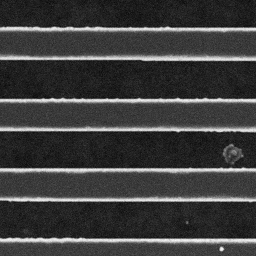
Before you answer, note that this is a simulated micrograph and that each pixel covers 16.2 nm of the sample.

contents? lines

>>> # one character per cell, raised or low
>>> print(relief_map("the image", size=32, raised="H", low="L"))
LLLLLLLLLLLLLLLLLLLLLLLLLLLLLLLL
LLLLLLLLLLLLLLLLLLLLLLLLLLLLLLLL
LLLLLLLLLLLLLLLLLLLLLLLLLLLLLLLL
LLLLLLLLLLLLLLLLLLLLLLLLLLLLLLLL
HHHHHHHHHHHHHHHHHHHHHHHHHHHHHHHH
HHHHHHHHHHHHHHHHHHHHHHHHHHHHHHHH
HHHHHHHHHHHHHHHHHHHHHHHHHHHHHHHH
LLLLLLLLLLLLLLLLLLLLLLLLLLLHHHHH
LLLLLLLLLLLLLLLLLLLLLLLLLLLLLLLL
LLLLLLLLLLLLLLLLLLLLLLLLLLLLLLLL
LLLLLLLLLLLLLLLLLLLLLLLLLLLLLLLL
LLLLLLLLLLLLLLLLLLLLLLLLLLLLLLLL
HHHHHHHHHHHHHHHHHHHHHHHHHHHHHHHH
HHHHHHHHHHHHHHHHHHHHHHHHHHHHHHHH
HHHHHHHHHHHHHHHHHHHHHHHHHHHHHHHH
HHHHHHHHHHHHHHHHHHHHHHHHHHHHHHHH
LLLLLLLLLLLLLLLLLLLLLLLLLLLLLLLL
LLLLLLLLLLLLLLLLLLLLLLLLLLLLLLLL
LLLLLLLLLLLLLLLLLLLLLLLLLLLLLLLL
LLLLLLLLLLLLLLLLLLLLLLLLLLLLLLLL
LLLLLLLLLLLLLLLLLLLLLLLLLLLLLLLL
HHHHHHHHHHHHHHHHHHHHHHHHHHHHHHHH
HHHHHHHHHHHHHHHHHHHHHHHHHHHHHHHH
HHHHHHHHHHHHHHHHHHHHHHHHHHHHHHHH
HHHHHHHHHHHHHHHHHHHHHHHHHHHHHHHH
LLLLLLLLLLLLLLLLLLLLLLLLLLLLLLLL
LLLLLLLLLLLLLLLLLLLLLLLLLLLLLLLL
LLLLLLLLLLLLLLLLLLLLLLLLLLLLLLLL
LLLLLLLLLLLLLLLLLLLLLLLLLLLLLLLL
LLLLLLLLLLLLLLLLLLLLLLLLLLLLLLLL
HHHHHHHHHHHHHHHHHHHHHHHHHHHHHHHH
HHHHHHHHHHHHHHHHHHHHHHHHHHHHHHHH